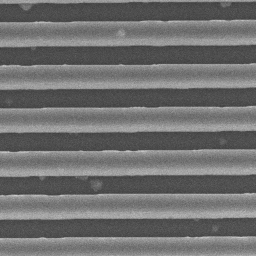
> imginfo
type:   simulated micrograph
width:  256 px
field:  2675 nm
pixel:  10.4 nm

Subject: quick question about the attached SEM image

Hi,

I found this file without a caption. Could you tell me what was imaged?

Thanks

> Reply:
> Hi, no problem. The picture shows lines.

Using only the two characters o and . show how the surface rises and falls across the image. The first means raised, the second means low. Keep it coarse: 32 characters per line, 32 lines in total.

................................
................................
................................
oooooooooooooooooooooooooooooooo
oooooooooooooooooooooooooooooooo
oooooooooooooooo...oo...........
................................
................................
oooooooooooooooooooooooooooooooo
oooooooooooooooooooooooooooooooo
oooooooooooooooooooooooooooooooo
................................
................................
................oo.ooooooooooooo
oooooooooooooooooooooooooooooooo
oooooooooooooooooooooooooooooooo
................................
................................
................................
oooooooooooooooooooooooooooooooo
oooooooooooooooooooooooooooooooo
oooooooooooooooooooooooooooooooo
................................
................................
oooooo.ooooooooooooooooooooooooo
oooooooooooooooooooooooooooooooo
oooooooooooooooooooooooooooooooo
................................
................................
................................
oooooooooooooooooooooooooooooooo
oooooooooooooooooooooooooooooooo